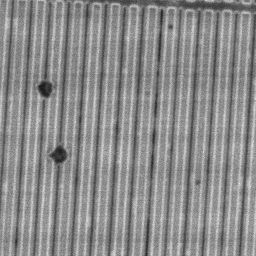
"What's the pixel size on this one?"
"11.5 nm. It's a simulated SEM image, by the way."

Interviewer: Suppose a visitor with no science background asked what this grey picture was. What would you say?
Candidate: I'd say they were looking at parallel lines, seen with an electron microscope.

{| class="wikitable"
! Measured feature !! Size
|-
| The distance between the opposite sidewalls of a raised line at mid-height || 0.0501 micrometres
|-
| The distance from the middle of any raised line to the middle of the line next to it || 107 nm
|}